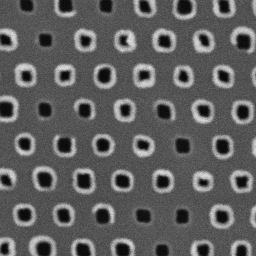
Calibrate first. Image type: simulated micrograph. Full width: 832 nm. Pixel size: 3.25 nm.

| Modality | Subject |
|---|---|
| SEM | a regular array of holes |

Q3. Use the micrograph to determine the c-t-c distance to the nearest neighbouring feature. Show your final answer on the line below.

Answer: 128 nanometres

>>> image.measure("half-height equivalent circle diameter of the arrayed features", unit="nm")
44.7